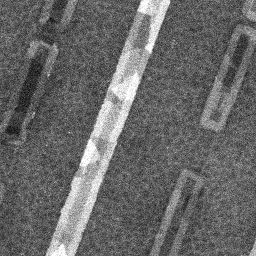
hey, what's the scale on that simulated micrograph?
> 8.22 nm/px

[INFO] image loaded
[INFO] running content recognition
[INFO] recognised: one or a few lines or trenches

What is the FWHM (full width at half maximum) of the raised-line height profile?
161 nm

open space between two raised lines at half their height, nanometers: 628